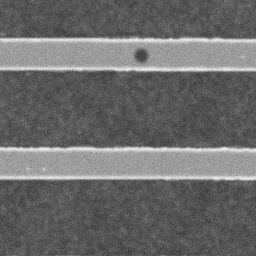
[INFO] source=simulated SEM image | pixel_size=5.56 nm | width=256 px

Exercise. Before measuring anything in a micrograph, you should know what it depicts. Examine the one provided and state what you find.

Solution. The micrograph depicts lines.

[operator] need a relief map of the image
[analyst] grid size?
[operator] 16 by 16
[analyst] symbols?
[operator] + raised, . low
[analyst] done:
................
................
++++++++++++++++
++++++++++++++++
................
................
................
................
................
++++++++++++++++
++++++++++++++++
................
................
................
................
................